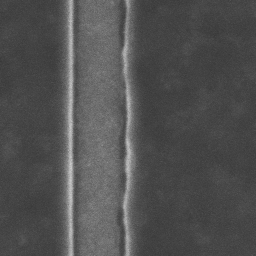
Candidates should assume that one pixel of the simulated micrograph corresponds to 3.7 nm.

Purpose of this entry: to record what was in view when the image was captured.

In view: one or a few lines or trenches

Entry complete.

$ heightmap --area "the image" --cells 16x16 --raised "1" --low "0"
1111000011111111
1111000011111111
1111000011111111
1111000011111111
1111000011111111
1111000011111111
1111000011111111
1111000011111111
1111000011111111
1111000011111111
1111000011111111
1111000011111111
1111000011111111
1111000011111111
1111000011111111
1111000011111111